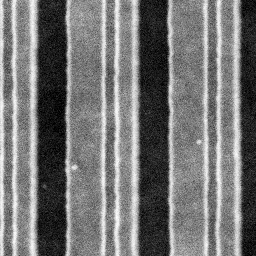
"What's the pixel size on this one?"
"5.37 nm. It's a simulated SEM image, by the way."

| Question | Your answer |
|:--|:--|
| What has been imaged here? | lines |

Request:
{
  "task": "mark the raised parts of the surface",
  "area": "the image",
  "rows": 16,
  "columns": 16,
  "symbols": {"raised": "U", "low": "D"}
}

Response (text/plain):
UUDDUUUUDDDUUUUD
UUDDUUUUDDDUUUUD
UUDDUUUUDDDUUUUD
UUDDUUUUDDDUUUUD
UUDDUUUUDDDUUUUD
UUDDUUUUDDDUUUUD
UUDDUUUUDDDUUUUD
UUDDUUUUDDDUUUUD
UUDDUUUUDDDUUUUD
UUDDUUUUDDDUUUUD
UUDDUUUUDDDUUUUD
UUDDUUUUDDDUUUUD
UUDDUUUUDDDUUUUD
UUDDUUUUDDDUUUUD
UUDDUUUUDDDUUUUD
UUDDUUUUDDDUUUUD